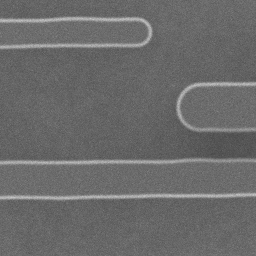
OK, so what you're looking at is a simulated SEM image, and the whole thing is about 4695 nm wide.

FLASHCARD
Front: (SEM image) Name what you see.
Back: groups of lines, slits or small figures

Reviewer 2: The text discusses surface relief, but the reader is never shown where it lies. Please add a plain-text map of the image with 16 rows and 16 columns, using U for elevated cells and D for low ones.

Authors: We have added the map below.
DDDDDDDDDDDDDDDD
UUUUUUUUUDDDDDDD
UUUUUUUUUDDDDDDD
DDDDDDDDDDDDDDDD
DDDDDDDDDDDDDDDD
DDDDDDDDDDDDUUUU
DDDDDDDDDDDUUUUU
DDDDDDDDDDDUUUUU
DDDDDDDDDDDDDDDD
DDDDDDDDDDDDDDDD
UUUUUUUUUUUUUUUU
UUUUUUUUUUUUUUUU
DDDDDDDDDDDDDDDD
DDDDDDDDDDDDDDDD
DDDDDDDDDDDDDDDD
DDDDDDDDDDDDDDDD